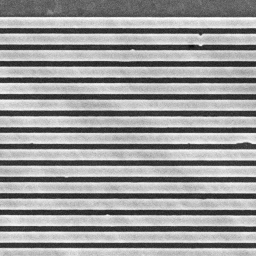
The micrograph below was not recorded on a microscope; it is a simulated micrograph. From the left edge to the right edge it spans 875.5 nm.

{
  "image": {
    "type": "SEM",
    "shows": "parallel lines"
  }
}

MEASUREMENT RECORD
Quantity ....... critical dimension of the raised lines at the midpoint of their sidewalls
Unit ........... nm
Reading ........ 37.6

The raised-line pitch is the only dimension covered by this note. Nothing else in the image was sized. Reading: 56.4 nanometres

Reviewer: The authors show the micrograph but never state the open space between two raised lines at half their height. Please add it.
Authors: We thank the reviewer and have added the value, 19.2 nanometers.